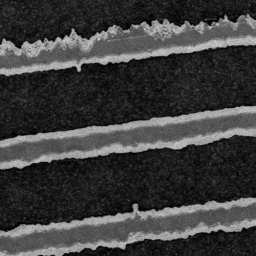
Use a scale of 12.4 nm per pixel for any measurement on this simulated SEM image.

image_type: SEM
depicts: one or a few lines or trenches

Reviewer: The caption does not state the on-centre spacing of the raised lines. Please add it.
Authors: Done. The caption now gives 1130 nm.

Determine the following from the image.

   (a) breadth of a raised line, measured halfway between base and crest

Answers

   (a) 297 nanometres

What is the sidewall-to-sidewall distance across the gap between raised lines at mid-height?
0.838 microns